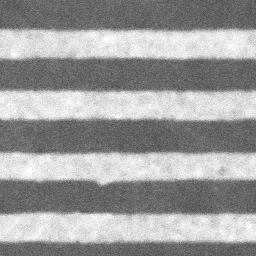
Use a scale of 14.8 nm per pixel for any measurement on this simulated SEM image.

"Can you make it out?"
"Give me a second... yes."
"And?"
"one or a few lines or trenches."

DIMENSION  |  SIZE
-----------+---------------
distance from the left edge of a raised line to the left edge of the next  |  61.3 pixels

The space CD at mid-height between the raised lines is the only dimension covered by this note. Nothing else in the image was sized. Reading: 523 nanometers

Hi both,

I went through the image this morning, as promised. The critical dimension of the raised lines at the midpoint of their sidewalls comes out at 26.2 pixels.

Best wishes